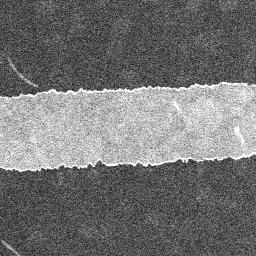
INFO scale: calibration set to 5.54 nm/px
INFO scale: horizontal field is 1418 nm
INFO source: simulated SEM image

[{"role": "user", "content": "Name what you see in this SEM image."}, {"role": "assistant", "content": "one or a few lines or trenches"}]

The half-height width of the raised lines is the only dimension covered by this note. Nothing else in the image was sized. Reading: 415 nm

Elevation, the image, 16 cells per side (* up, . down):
................
................
................
................
................
.........*******
****************
****************
****************
****************
***.............
................
................
................
................
................